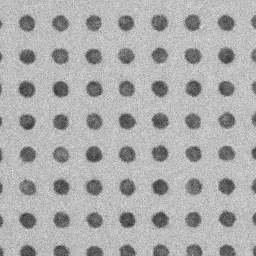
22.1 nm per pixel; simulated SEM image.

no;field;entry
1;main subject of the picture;a regular array of holes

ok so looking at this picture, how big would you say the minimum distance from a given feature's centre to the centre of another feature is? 720 nm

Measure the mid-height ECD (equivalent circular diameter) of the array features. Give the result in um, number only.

0.386